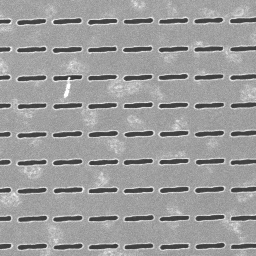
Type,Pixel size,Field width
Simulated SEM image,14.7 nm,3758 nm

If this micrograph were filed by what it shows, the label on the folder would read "a regular array of holes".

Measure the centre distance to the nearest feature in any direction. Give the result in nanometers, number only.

410